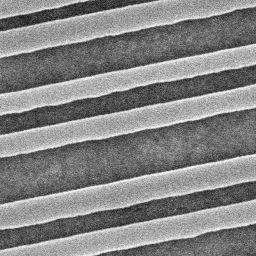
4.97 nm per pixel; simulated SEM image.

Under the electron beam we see lines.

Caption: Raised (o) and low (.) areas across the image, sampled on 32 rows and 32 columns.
ooooooooo.........oooooooooooooo
oooo.........oooooooooooooooo...
........ooooooooooooooo.........
...ooooooooooooooo..............
ooooooooooooo...................
oooooooo........................
oooo.......................ooooo
......................oooooooooo
.................ooooooooooooo..
............oooooooooooo........
.......oooooooooooo.............
..oooooooooooo..............oooo
ooooooooo..............ooooooooo
oooo.............oooooooooooooo.
............oooooooooooooo......
.......ooooooooooooooo..........
..ooooooooooooooo...............
ooooooooooo.....................
oooooo..........................
o..............................o
..........................oooooo
.....................ooooooooooo
...............ooooooooooooooooo
..........ooooooooooooooooo.....
.....oooooooooooooooo...........
.oooooooooooooooo.............oo
oooooooooooo............oooooooo
ooooooo............ooooooooooooo
o.............oooooooooooooo....
.........oooooooooooooooo.......
.....oooooooooooooo.............
ooooooooooooo...................